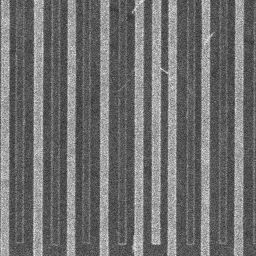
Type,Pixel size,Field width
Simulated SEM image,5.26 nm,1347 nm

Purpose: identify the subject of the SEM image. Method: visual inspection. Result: parallel lines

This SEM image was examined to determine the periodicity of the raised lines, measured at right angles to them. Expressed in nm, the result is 87.8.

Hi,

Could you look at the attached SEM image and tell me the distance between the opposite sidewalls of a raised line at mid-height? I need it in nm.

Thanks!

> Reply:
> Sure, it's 39.4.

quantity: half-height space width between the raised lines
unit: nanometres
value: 47.3